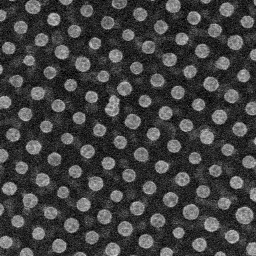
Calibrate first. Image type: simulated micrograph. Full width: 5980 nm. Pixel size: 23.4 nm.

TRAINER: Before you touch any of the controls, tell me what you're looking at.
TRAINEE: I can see a regular array of raised bodies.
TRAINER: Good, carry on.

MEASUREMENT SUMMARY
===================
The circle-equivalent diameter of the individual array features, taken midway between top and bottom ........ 284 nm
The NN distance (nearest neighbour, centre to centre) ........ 557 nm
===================